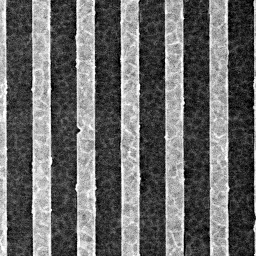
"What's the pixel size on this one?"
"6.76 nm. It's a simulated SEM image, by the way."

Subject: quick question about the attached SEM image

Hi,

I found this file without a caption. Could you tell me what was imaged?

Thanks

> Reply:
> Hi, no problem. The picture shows parallel lines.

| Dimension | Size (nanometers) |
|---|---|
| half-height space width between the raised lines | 180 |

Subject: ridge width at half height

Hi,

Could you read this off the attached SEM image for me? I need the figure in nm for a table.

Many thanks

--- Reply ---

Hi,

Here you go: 119